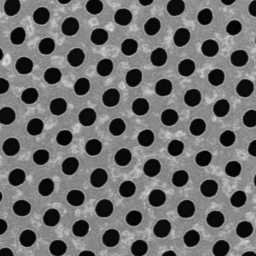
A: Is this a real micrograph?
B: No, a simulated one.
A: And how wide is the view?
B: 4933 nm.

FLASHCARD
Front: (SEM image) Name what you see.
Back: a regular array of holes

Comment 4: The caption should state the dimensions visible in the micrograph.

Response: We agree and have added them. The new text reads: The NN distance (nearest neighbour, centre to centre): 0.581 microns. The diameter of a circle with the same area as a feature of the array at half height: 334 nm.